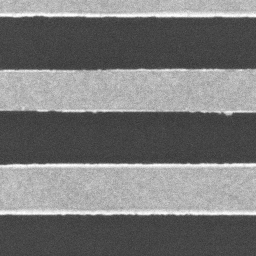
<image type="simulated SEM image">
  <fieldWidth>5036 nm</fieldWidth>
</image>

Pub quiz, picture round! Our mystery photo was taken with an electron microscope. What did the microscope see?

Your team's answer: lines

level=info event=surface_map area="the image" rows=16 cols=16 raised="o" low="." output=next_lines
oooooooooooooooo
................
................
................
oooooooooooooooo
oooooooooooooooo
oooooooooooooooo
................
................
................
oooooooooooooooo
oooooooooooooooo
oooooooooooooooo
................
................
................